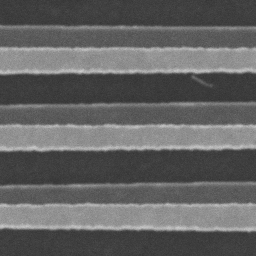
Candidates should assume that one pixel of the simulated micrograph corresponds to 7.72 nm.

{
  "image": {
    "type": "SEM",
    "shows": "lines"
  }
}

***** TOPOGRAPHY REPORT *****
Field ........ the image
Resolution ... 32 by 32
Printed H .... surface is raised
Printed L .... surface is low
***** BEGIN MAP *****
LLLLLLLLLLLLLLLLLLLLLLLLLLLLLLLL
LLLLLLLLLLLLLLLLLLLLLLLLLLLLLLLL
LLLLLLLLLLLLLLLLLLLLLLLLLLLLLLLL
HHHHHHHHHHHHHHHHHHHHHHHHHHHHHHHH
HHHHHHHHHHHHHHHHHHHHHHHHHHHHHHHH
HHHHHHHHHHHHHHHHHHHHHHHHHHHHHHHH
HHHHHHHHHHHHHHHHHHHHHHHHHHHHHHHH
HHHHHHHHHHHHHHHHHHHHHHHHHHHHHHHH
HHHHHHHHHHHHHHHHHHHHHHHHHHHHHHHH
LLLLLLLLLLLLLLLLLLLLLLLLLLLLLLLL
LLLLLLLLLLLLLLLLLLLLLLLLLLLLLLLL
LLLLLLLLLLLLLLLLLLLLLLLLLLLLLLLL
LLLLLLLLLLLLLLLLLLLLLLLLLLLLLLLL
HHHHHHHHHHHHHHHHHHHHHHHHHHHHHHHH
HHHHHHHHHHHHHHHHHHHHHHHHHHHHHHHH
HHHHHHHHHHHHHHHHHHHHHHHHHHHHHHHH
HHHHHHHHHHHHHHHHHHHHHHHHHHHHHHHH
HHHHHHHHHHHHHHHHHHHHHHHHHHHHHHHH
HHHHHHHHHHHHHHHHHHHHHHHHHHHHLHLL
LLLLLLLLLLLLLLLLLLLLLLLLLLLLLLLL
LLLLLLLLLLLLLLLLLLLLLLLLLLLLLLLL
LLLLLLLLLLLLLLLLLLLLLLLLLLLLLLLL
LLLLLLLLLLLLLLLLLLLLLLLLLLLLLLLL
HHHHHHHHHHHHHHHHHHHHHHHHHHHHHHHH
HHHHHHHHHHHHHHHHHHHHHHHHHHHHHHHH
HHHHHHHHHHHHHHHHHHHHHHHHHHHHHHHH
HHHHHHHHHHHHHHHHHHHHHHHHHHHHHHHH
HHHHHHHHHHHHHHHHHHHHHHHHHHHHHHHH
LHHHHHHHHHHHHHHHHHHHHHHHHHHHHHHH
LLLLLLLLLLLLLLLLLLLLLLLLLLLLLLLL
LLLLLLLLLLLLLLLLLLLLLLLLLLLLLLLL
LLLLLLLLLLLLLLLLLLLLLLLLLLLLLLLL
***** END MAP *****